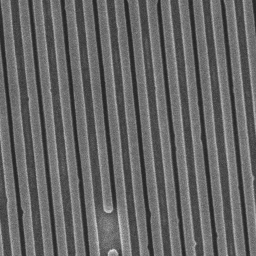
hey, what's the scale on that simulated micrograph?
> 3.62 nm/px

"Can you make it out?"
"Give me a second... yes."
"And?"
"parallel lines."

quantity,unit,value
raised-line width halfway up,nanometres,34.2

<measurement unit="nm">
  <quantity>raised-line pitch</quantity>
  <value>57.6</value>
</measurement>